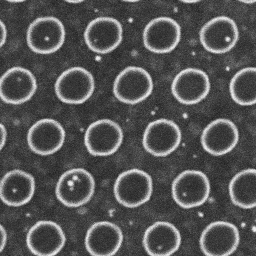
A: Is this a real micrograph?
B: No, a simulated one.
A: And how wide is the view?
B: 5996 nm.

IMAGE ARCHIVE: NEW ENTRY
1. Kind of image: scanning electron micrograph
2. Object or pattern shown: a regular array of raised bodies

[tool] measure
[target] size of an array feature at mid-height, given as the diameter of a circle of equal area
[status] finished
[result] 0.83 microns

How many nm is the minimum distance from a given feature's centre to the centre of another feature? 1350